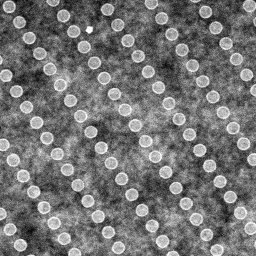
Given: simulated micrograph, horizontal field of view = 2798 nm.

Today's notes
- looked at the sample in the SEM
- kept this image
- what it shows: a regular array of raised bodies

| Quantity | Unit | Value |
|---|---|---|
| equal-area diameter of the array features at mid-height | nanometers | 130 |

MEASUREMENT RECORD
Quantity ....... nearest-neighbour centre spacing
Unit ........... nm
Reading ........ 204